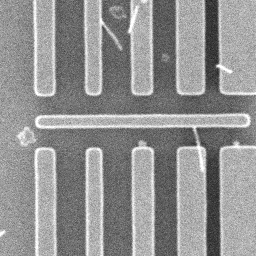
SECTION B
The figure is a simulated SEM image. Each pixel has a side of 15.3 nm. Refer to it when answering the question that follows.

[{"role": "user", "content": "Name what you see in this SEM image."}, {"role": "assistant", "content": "groups of lines, slits or small figures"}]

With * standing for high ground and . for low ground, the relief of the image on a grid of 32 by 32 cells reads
....***....**...***...***..*****
....***....**...***...***..*****
....***....**...***...***..*****
....***....**...***...***..*****
....***....**...***...***..*****
....***....**...***...***..*****
....***....**...***...***..*****
....***....**...***...***..*****
....***....**....**...***..*****
....***....**....**...***...****
....***....**....**...***...****
.....**....*.....**...***...****
................................
................................
...........********************.
.....**************************.
................................
................................
.......................**...****
....***....**....**...****..****
....***....**....**...****..****
....***....**....**...****..****
.....**....**....**...****..****
.....**....**....**...****..****
.....**....**....**...****..****
.....**....**....**...****..****
.....**....**....**...****..****
.....**....**....**...****..****
.....**....**....**...****..****
.....**....**....**...****..****
.....**....**....**...****..****
.....**....**....**...****..****